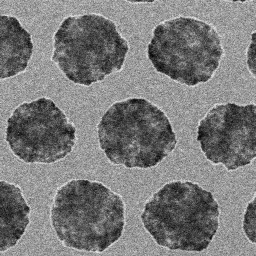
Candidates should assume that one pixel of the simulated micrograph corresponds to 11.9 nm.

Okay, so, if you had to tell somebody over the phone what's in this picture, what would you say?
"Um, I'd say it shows holes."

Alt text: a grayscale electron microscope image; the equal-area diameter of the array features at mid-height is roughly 850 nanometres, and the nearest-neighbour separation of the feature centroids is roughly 1130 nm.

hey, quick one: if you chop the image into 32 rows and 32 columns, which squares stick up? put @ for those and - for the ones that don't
@@@@@@@@@@@@@@@@@@@@@@@@@@@@@@@@
@@@@@@@@@@@@@@@@@@@@@@@@@@@@@@@@
--@@@@@@------@@@@@@@----@@@@@@@
---@@@@--------@@@@--------@@@@@
----@@@--------@@@@--------@@@@-
----@@@---------@@@---------@@@-
----@@@---------@@----------@@@-
----@@@---------@@@---------@@@-
---@@@@--------@@@@--------@@@@-
--@@@@@@-----@@@@@@@@------@@@@@
@@@@@@@@@@-@@@@@@@@@@@@--@@@@@@@
@@@@@@@@@@@@@@@@@@@@@@@@@@@@@@@@
@@@@--@@@@@@@@@@--@@@@@@@@@@@@@@
@@-----@@@@@@@------@@@@@@@-----
@-------@@@@@--------@@@@@------
@--------@@@---------@@@@-------
@--------@@@----------@@@-------
@--------@@@----------@@@-------
@--------@@@@---------@@@-------
@@------@@@@@--------@@@@@------
@@@@@@@@@@@@@@@-----@@@@@@@@---@
@@@@@@@@@@@@@@@@@@@@@@@@@@@@@@@@
@@@@@@@@@--@@@@@@@@@@@@@@@@@@@@@
--@@@@@------@@@@@@@-----@@@@@@@
---@@@@--------@@@@--------@@@@@
---@@@@--------@@@---------@@@@-
----@@----------@@---------@@@@-
----@@----------@@---------@@@--
---@@@@--------@@@---------@@@--
---@@@@--------@@@@--------@@@@-
--@@@@@@------@@@@@@---@--@@@@@@
@@@@@@@@@@@@@@@@@@@@@@@@@@@@@@@@